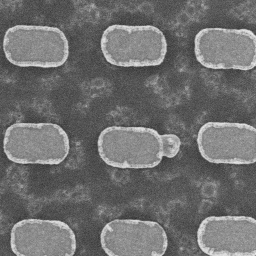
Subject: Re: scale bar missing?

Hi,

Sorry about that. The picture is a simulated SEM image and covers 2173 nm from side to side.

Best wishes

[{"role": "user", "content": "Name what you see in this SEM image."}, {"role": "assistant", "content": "raised bodies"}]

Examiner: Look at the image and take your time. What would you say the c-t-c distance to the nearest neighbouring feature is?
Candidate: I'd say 0.824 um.